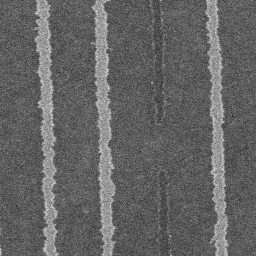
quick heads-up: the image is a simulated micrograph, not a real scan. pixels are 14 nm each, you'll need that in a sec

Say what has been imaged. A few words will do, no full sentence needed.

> parallel lines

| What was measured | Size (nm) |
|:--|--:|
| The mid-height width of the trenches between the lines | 654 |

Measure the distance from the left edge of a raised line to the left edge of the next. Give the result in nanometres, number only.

794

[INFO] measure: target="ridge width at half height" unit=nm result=138